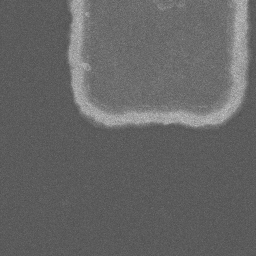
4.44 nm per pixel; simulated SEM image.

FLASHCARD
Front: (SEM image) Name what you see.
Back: one or a few lines or trenches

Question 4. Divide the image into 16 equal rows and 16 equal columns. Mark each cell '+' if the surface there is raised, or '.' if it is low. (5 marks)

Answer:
.....++++++++++.
.....++++++++++.
.....++++++++++.
.....++++++++++.
.....++++++++++.
.....++++++++++.
.....+++++++++..
............+...
................
................
................
................
................
................
................
................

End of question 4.